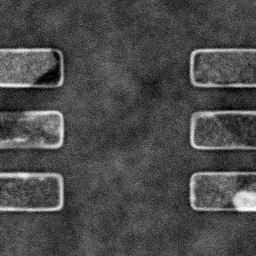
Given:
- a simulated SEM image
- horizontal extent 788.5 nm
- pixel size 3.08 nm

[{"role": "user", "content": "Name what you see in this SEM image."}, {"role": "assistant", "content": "groups of lines, slits or small figures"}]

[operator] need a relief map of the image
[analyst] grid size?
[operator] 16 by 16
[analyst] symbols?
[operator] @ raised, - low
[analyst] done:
----------------
----------------
----------------
@@@@--------@@@@
@@@@--------@@@@
----------------
----------------
@@@@--------@@@@
@@@@--------@@@@
----------------
----------------
@@@@--------@@@@
@@@@--------@@@@
----------------
----------------
----------------